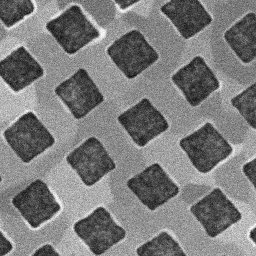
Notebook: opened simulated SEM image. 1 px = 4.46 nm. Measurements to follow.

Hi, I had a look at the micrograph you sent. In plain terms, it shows a regular array of holes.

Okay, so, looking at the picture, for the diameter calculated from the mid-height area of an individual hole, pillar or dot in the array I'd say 0.195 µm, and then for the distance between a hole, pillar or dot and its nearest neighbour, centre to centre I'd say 65.2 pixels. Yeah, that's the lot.